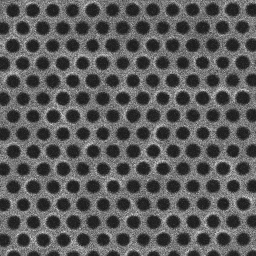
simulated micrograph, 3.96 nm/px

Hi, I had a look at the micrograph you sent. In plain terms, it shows a regular array of holes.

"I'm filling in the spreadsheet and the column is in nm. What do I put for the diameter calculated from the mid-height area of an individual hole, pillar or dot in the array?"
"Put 53.5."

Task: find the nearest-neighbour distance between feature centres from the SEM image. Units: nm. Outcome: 78.6